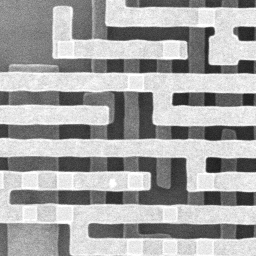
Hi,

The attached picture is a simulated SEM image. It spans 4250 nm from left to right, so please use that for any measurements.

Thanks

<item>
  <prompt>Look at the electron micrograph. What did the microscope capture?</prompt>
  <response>wiring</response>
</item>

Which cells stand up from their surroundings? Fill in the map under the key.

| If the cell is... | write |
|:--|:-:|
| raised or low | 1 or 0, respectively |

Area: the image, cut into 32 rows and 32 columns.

00000000000001110000000000000000
00000001100001111111111111111111
00000001100001111111111111111111
00000001100000000000000000011000
00000001100000000000000000011000
00000001111111111111111000111111
00000001111111111111111000111111
00000000000000000000000000111100
00000000000000000000000000000000
11111111111111111111111111111111
11111111111111111111111111111111
00000000000000000001110000000111
00000000000000000001100000000000
11111111111110000001111111111111
11111111111110000001111111111111
00000000000110000000111111111111
00000000000000000000000000000000
11001100111110000011000110000000
11111111111111111111111111111111
11000000011000110011111111111111
00000000000000000000000111000000
11001110000000000000000111000000
11111111111111111110000111111111
11111111111111111110000111111111
10000000000000000000000000000000
11000000000000000000000000000000
11111111111111111111111111111111
11111111111111111111111111111111
00000000011000000000000000000000
00000000011000000000000000000000
00000000011111111111111111111111
00000000011111111111111111111111